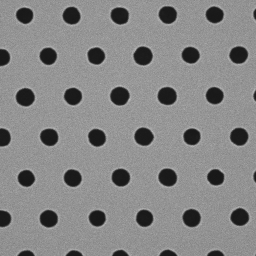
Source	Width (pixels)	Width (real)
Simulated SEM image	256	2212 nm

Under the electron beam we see a regular array of holes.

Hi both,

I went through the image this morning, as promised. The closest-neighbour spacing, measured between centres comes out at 403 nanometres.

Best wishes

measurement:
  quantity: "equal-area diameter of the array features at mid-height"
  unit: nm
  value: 156